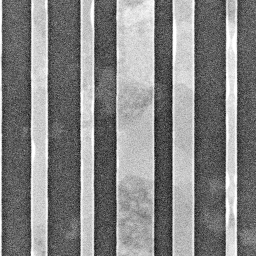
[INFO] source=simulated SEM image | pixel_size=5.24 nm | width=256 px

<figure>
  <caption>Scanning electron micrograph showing groups of lines, slits or small figures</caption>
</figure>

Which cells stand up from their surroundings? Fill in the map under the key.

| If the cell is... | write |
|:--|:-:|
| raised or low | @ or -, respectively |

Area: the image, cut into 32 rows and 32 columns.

----@@----@@---@@@@---@@----@@--
----@@----@----@@@@---@@----@@--
----@@----@@---@@@@---@@----@@--
----@@----@@---@@@@---@@----@@--
----@@----@@---@@@@---@@----@---
----@@----@@---@@@@---@@----@---
----@@----@@---@@@@---@@----@---
----@@----@@---@@@@---@@----@@--
----@@----@@---@@@@---@@----@@--
----@@----@@---@@@@---@@----@@--
----@@----@@---@@@@---@@----@@--
----@@----@@---@@@@---@@----@---
----@@----@@---@@@@---@@----@@--
----@@----@@---@@@@---@@----@@--
----@@----@@---@@@@---@@----@@--
----@@----@@---@@@@---@@----@@--
----@@----@@---@@@@---@@----@@--
----@@----@@---@@@@---@@----@@--
----@@----@@---@@@@---@@----@@--
----@@----@@---@@@@---@@----@@--
----@@----@@---@@@@---@@----@@--
----@@----@@---@@@@---@@----@@--
----@@----@@---@@@@---@@----@---
----@@----@@---@@@@---@@----@@--
----@@----@@---@@@@---@@----@@--
----@@----@@---@@@@---@@----@---
----@@----@@---@@@@---@@----@---
----@@----@@---@@@@---@@----@@--
----@@----@@---@@@@---@@----@@--
----@@----@@---@@@@---@@----@@--
----@@----@@---@@@@---@@----@@--
----@@----@@---@@@@---@@----@@--